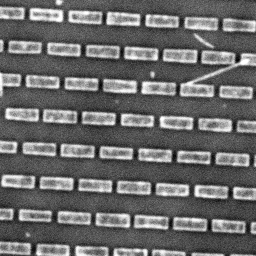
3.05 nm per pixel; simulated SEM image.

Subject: an array of small figures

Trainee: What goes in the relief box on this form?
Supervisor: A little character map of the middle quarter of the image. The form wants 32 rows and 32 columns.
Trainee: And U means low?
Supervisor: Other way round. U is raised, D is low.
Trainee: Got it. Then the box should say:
DDDDDDDDDDDDDDDDDDDDDDDDDDDDDDDD
DDDDDDDDDDDDDDDDDDDDDDDDDDDDDDDD
DDDDDDDDDDDDDDDDDDDDDDDDDDDDDDDD
DDDDDDDDDDDDDDDDDDDDDDDDDDDDDDDD
UUUUUUUUDDUUUUUUDDDDDDDDDDDDDDDD
UUUUUUUUDDUUUUUUUUDDUUUUUUUUDUUU
DDDDDDDDDDUUUUUUUUDDUUUUUUUUDUUU
DDDDDDDDDDDDDDDDDDDDDDDDDDUDDUUU
DDDDDDDDDDDDDDDDDDDDDDDDDDDDDDDD
DDDDDDDDDDDDDDDDDDDDDDDDDDDDDDDD
DDDDDDDDDDDDDDDDDDDDDDDDDDDDDDDD
DDDDDDDDDDDDDDDDDDDDDDDDDDDDDDDD
UUUDDUUUUUUUDDDDDDDDDDDDDDDDDDDD
UUUDDUUUUUUUUDDUUUUUUUDDUUUUUUDD
UUUDDUUUUUUUUDUUUUUUUUDDUUUUUUUU
DDDDDDDDDDDDDDDDDDDDDDDDDUUUUUUU
DDDDDDDDDDDDDDDDDDDDDDDDDDDDDDDD
DDDDDDDDDDDDDDDDDDDDDDDDDDDDDDDD
DDDDDDDDDDDDDDDDDDDDDDDDDDDDDDDD
DDDDDDDDDDDDDDDDDDDDDDDDDDDDDDDD
UUUDDDDDDDDDDDDDDDDDDDDDDDDDDDDD
UUUUUUUUDUUUUUUUUDDUUDDDDDDDDDDD
UUUUUUUDDUUUUUUUUDDUUUUUUUUDDUUU
DDDDDDDDDDDDDDUUUDDUUUUUUUUDDUUU
DDDDDDDDDDDDDDDDDDDDDDDDDDDDDDDD
DDDDDDDDDDDDDDDDDDDDDDDDDDDDDDDD
DDDDDDDDDDDDDDDDDDDDDDDDDDDDDDDD
DDDDDDDDDDDDDDDDDDDDDDDDDDDDDDDD
DDDDDDDDDDDDDDDDDDDDDDDDDDDDDDDD
UUDDUUUUUUUUDDUUUDDDDDDDDDDDDDDD
UUDDUUUUUUUUDDUUUUUUUDDUUUUUUUUD
DDDDDUUUUUUUDDUUUUUUUDDUUUUUUUUD